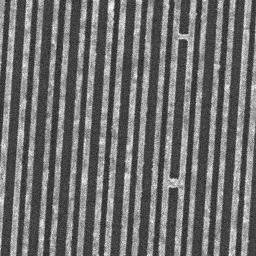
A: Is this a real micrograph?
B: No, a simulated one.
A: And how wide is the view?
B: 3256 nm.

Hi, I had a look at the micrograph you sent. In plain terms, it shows parallel lines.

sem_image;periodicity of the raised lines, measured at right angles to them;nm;174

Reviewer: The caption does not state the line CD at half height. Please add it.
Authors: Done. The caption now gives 66.6 nanometers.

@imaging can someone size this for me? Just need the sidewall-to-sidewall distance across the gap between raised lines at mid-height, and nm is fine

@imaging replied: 88.8